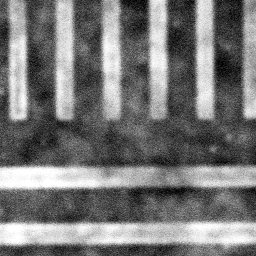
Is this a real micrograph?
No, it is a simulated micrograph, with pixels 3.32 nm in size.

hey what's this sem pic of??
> groups of lines, slits or small figures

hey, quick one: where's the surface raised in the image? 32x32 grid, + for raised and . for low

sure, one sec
.++....++....++....++....++....+
.++....++....++....++....++....+
.++....++....++....++....++....+
.++....++....++....++....++....+
.++....++....++....++....++....+
.++....++....++....++....+.....+
.++....++....++....++....++....+
.++....++....++....++....++....+
..+....++....++....++....++....+
..+....++....++....++....++....+
..+....++....++....++....++....+
..+....++....++....++....++....+
..+....++....++....++....++....+
..+....++....++....++....++....+
..+....++....++....++....+.....+
................................
................................
................................
................................
................................
................................
++++++++++++++++++++++++++++++++
++++++++++++++++++++++++++++++++
................................
................................
................................
................................
................................
++++++++++++++++++++++++++++++++
++++++++++++++++++++++++++++++++
................................
................................